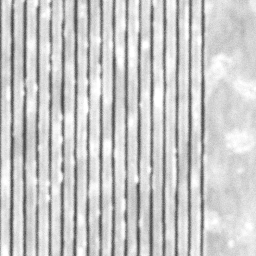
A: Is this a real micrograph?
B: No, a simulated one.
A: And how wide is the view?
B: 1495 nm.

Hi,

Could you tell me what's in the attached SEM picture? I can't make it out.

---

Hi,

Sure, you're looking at parallel lines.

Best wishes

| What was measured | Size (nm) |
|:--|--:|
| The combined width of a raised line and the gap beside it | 74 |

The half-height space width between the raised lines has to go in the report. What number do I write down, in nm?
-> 22.6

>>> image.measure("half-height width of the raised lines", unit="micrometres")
0.0511